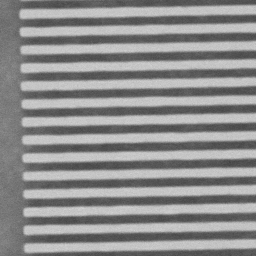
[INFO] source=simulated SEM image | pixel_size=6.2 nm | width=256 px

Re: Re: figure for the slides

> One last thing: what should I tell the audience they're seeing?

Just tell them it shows groups of lines, slits or small figures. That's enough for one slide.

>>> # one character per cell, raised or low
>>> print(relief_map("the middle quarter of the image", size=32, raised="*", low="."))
********************************
****************................
................................
................................
********************************
********************************
................................
................................
................****************
********************************
************************........
................................
................................
********************************
********************************
................................
................................
.....................***********
********************************
******************..............
................................
................................
********************************
********************************
................................
................................
................****************
********************************
***********************.........
................................
................................
********************************